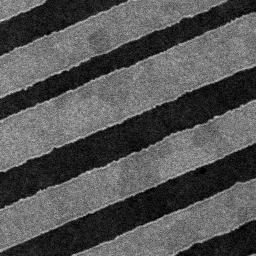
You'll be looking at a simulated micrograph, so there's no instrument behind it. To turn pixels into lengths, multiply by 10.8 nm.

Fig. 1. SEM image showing one or a few lines or trenches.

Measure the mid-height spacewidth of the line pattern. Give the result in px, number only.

33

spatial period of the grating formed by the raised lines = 784 nm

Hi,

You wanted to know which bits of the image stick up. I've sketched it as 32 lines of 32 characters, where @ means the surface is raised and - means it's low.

@@@@@----------@@@@@@@@@@@@-----
@@@----------@@@@@@@@@@@@-------
-----------@@@@@@@@@@@@------@@@
---------@@@@@@@@@@@@------@@@@@
------@@@@@@@@@@@@-------@@@@@@@
----@@@@@@@@@@@--------@@@@@@@@@
-@@@@@@@@@@@@@------@@@@@@@@@@@@
@@@@@@@@@@@-------@@@@@@@@@@@@@@
@@@@@@@@@-------@@@@@@@@@@@@@@@-
@@@@@@-------@@@@@@@@@@@@@@@----
@@@@-------@@@@@@@@@@@@@@@------
@@------@@@@@@@@@@@@@@@---------
------@@@@@@@@@@@@@@@@----------
----@@@@@@@@@@@@@@@-----------@@
-@@@@@@@@@@@@@@@@-----------@@@@
@@@@@@@@@@@@@@------------@@@@@@
@@@@@@@@@@@@-----------@@@@@@@@@
@@@@@@@@@-----------@@@@@@@@@@@@
@@@@@@@-----------@@@@@@@@@@@@--
@@@@@-----------@@@@@@@@@@@@----
@@@-----------@@@@@@@@@@@@------
-----------@@@@@@@@@@@@---------
---------@@@@@@@@@@@@----------@
------@@@@@@@@@@@@@----------@@@
----@@@@@@@@@@@@-----------@@@@@
--@@@@@@@@@@@@----------@@@@@@@@
@@@@@@@@@@@-----------@@@@@@@@@@
@@@@@@@@@-----------@@@@@@@@@@@-
@@@@@@@----------@@@@@@@@@@@@---
@@@@@----------@@@@@@@@@@@@-----
@@-----------@@@@@@@@@@@--------
----------@@@@@@@@@@@@----------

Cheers